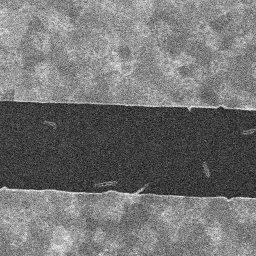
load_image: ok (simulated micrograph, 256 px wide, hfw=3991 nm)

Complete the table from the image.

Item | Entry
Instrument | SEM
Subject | one or a few lines or trenches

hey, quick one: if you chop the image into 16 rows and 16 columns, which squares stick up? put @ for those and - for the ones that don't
@@@@@@@@@@@@@@@@
@@@@@@@@@@@@@@@@
@@@@@@@@@@@@@@@@
@@@@@@@@@@@@@@@@
@@@@@@@@@@@@@@@@
@@@@@@@@@@@@@@@@
------@@@@@@@@@@
----------------
----------------
----------------
----------------
----------------
@@@@@@@@@@@@@@@@
@@@@@@@@@@@@@@@@
@@@@@@@@@@@@@@@@
@@@@@@@@@@@@@@@@